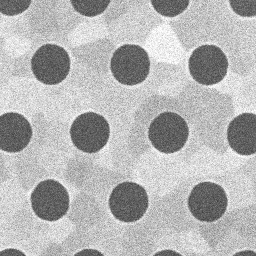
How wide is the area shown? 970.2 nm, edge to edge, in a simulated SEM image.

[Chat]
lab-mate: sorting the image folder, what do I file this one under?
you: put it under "a regular array of holes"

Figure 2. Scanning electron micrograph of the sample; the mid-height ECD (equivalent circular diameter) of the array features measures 156 nm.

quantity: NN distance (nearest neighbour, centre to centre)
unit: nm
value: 297